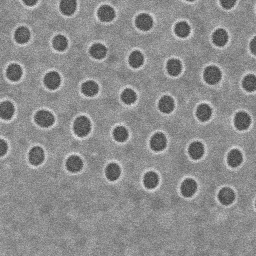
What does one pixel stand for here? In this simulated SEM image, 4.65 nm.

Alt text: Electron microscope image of a regular array of holes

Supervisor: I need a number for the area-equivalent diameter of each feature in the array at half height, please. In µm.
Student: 0.09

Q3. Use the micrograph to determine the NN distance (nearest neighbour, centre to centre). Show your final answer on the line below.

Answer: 0.178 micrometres